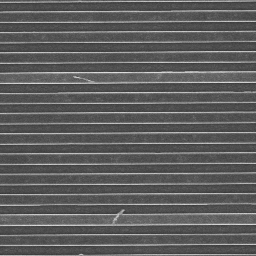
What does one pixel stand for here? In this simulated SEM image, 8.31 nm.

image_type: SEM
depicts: parallel lines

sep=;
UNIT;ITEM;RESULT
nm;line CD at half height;89.4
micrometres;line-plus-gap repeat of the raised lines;0.169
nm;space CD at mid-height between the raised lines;72.7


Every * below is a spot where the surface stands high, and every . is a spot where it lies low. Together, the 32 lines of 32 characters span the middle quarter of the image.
................................
................................
********************************
********************************
********************************
................................
................................
********************************
********************************
********************************
................................
................................
********************************
********************************
********************************
................................
................................
********************************
********************************
********************************
................................
................................
..............******************
********************************
********************************
................................
................................
................................
********************************
********************************
................................
................................